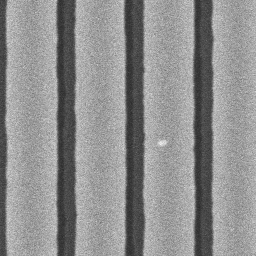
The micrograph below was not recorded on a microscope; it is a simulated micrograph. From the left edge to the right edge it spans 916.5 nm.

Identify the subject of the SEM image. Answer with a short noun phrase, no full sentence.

lines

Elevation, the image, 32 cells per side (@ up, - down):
-@@@@@@--@@@@@@---@@@@@@---@@@@@
-@@@@@@--@@@@@@---@@@@@@---@@@@@
-@@@@@@--@@@@@@---@@@@@@---@@@@@
-@@@@@@--@@@@@@---@@@@@@---@@@@@
-@@@@@@--@@@@@@@--@@@@@@---@@@@@
-@@@@@@--@@@@@@@--@@@@@@---@@@@@
-@@@@@@--@@@@@@@--@@@@@@---@@@@@
-@@@@@@--@@@@@@@--@@@@@@---@@@@@
-@@@@@@--@@@@@@@--@@@@@@---@@@@@
-@@@@@@---@@@@@@--@@@@@@---@@@@@
-@@@@@@--@@@@@@@--@@@@@@---@@@@@
-@@@@@@--@@@@@@@--@@@@@@---@@@@@
-@@@@@@--@@@@@@@--@@@@@@---@@@@@
-@@@@@@--@@@@@@@--@@@@@@---@@@@@
-@@@@@@--@@@@@@@--@@@@@@---@@@@@
-@@@@@@---@@@@@@--@@@@@@---@@@@@
-@@@@@@--@@@@@@@--@@@@@@---@@@@@
-@@@@@@--@@@@@@@--@@@@@@---@@@@@
-@@@@@@--@@@@@@@--@@@@@@---@@@@@
-@@@@@@--@@@@@@@--@@@@@@---@@@@@
-@@@@@@--@@@@@@@--@@@@@@---@@@@@
-@@@@@@--@@@@@@@--@@@@@@---@@@@@
-@@@@@@--@@@@@@@--@@@@@@---@@@@@
-@@@@@@--@@@@@@@--@@@@@@---@@@@@
-@@@@@@--@@@@@@@--@@@@@@---@@@@@
-@@@@@@--@@@@@@@--@@@@@@---@@@@@
-@@@@@@---@@@@@@--@@@@@@---@@@@@
-@@@@@@---@@@@@@--@@@@@@---@@@@@
-@@@@@@---@@@@@@--@@@@@@---@@@@@
-@@@@@@---@@@@@@--@@@@@@---@@@@@
-@@@@@@--@@@@@@@--@@@@@@---@@@@@
-@@@@@@--@@@@@@@--@@@@@@---@@@@@